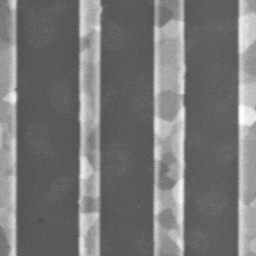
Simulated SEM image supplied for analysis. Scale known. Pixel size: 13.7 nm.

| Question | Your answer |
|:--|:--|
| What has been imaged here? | one or a few lines or trenches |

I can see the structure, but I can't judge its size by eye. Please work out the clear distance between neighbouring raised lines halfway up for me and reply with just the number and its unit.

0.808 um